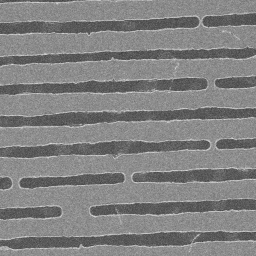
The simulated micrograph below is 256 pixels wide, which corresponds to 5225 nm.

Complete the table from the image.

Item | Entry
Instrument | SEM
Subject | parallel lines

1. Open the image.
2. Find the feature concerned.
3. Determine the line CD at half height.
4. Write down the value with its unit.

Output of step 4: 398 nm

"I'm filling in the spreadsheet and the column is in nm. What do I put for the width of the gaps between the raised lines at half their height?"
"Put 224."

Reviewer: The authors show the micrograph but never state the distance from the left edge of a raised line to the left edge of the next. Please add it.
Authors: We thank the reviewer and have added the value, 626 nanometres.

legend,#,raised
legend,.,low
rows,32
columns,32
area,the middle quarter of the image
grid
################################
################################
################################
#############################...
####............................
......................#.........
..........................#.....
################################
################################
################################
################################
######################.#...#....
................................
................................
.............##..#.#############
.....###########################
################################
################################
################################
#########.............##........
................................
................................
...................#############
################################
################################
################################
##############################..
#####..........##...............
...............##...............
...............###..............
.###.###########################
################################